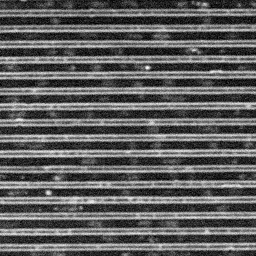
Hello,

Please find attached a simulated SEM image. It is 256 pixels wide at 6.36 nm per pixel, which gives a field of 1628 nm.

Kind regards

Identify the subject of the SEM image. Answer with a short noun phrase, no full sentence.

parallel lines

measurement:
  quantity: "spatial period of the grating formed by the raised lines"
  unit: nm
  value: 99.3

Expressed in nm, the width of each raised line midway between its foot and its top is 35.8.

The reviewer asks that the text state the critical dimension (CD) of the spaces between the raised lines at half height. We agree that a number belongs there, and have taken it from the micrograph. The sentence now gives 66 nm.